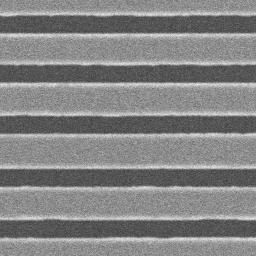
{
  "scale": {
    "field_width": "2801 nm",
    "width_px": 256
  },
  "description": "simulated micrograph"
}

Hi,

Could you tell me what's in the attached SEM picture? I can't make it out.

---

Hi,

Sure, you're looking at lines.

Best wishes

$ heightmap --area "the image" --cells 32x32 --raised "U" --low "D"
UUUUUUUUUUUUUUUUUUUUUUUUUUUUUUUU
UUUUUUUUUUUUUUUUUUUUUUUUUUUUUUUU
DDDDDDDDDDDDDDDDDDDDDDDDDDDDDDDD
DDDDDDDDDDDDDDDDDDDDDDDDDDDDDDDD
UUUUUUUUUUUUUUUUUUUUUUUUUUUUUUUU
UUUUUUUUUUUUUUUUUUUUUUUUUUUUUUUU
UUUUUUUUUUUUUUUUUUUUUUUUUUUUUUUU
UUUUUUUUUUUUUUUUUUUUUUUUUUUUUUUU
DDDDDDDDDDDDDDDDDDDDDDDDDDDDDDDD
DDDDDDDDDDDDDDDDDDDDDDDDDDDDDDDD
UUUUUUUUUUUUUUUUUUUUUUUUUUUUUUUU
UUUUUUUUUUUUUUUUUUUUUUUUUUUUUUUU
UUUUUUUUUUUUUUUUUUUUUUUUUUUUUUUU
UUUUUUUUUUUUUUUUUUUUUUUUUUUUUUUU
DDDDDDDUUDDDDUUDDDDDDDDDDDDDDDDD
DDDDDDDDDDDDDDDDDDDDDDDDDDDDDDDD
DDDDDDDDDDDDDDDDDDDDDDDDDDDDDDDD
UUUUUUUUUUUUUUUUUUUUUUUUUUUUUUUU
UUUUUUUUUUUUUUUUUUUUUUUUUUUUUUUU
UUUUUUUUUUUUUUUUUUUUUUUUUUUUUUUU
UUUUUUUUUUUUUUUUUUUUUUUUUUUUUUUU
DDDDDDDDDDDDDDDDDDDDDDDDDDDDDDDD
DDDDDDDDDDDDDDDDDDDDDDDDDDDDDDDD
UUUUUUUUUUUUUUUUUUUUUUUUUUUUUUUU
UUUUUUUUUUUUUUUUUUUUUUUUUUUUUUUU
UUUUUUUUUUUUUUUUUUUUUUUUUUUUUUUU
UUUUUUUUUUUUUUUUUUUUUUUUUUUUUUUU
DDDDDDDDDDDDDDDDDDDDDDDDDDDDDDDD
DDDDDDDDDDDDDDDDDDDDDDDDDDDDDDDD
DDDDDDDDDDDDDDDDDDDDDDDDDDDDDDDD
UUUUUUUUUUUUUUUUUUUUUUUUUUUUUUUU
UUUUUUUUUUUUUUUUUUUUUUUUUUUUUUUU